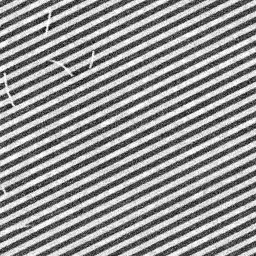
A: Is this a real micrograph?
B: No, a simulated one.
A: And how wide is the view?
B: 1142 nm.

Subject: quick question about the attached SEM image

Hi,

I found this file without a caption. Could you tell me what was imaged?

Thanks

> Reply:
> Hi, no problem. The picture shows parallel lines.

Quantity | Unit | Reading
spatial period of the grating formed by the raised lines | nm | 47.1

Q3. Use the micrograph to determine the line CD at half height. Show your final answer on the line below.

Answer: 20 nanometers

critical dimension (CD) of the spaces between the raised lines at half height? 28 nm